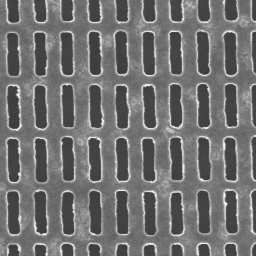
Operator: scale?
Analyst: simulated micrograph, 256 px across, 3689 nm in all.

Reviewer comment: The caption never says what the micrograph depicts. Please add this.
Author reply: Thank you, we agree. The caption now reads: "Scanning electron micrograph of a regular array of holes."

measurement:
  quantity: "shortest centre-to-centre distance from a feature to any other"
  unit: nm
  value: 389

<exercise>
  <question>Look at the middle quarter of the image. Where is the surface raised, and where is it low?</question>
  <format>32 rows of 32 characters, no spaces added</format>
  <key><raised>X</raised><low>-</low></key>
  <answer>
--XXXX---XXXX---XXXX---XXXX---XX
--XXXX---XXXX---XXXX---XXXX---XX
--XXXXX--XXXXXXXXXXXX-XXXXX--XXX
XXXXXXXXXXXXXXXXXXXXXXXXXXXXXXXX
XXXXXXXXXXXXXXXXXXXXXXXXXXXXXXXX
--XXXXX--XXXX--XXXXX--XXXXX--XXX
--XXXX---XXXX---XXXX---XXX---XXX
--XXXX---XXXX---XXXX---XXX---XXX
--XXXX---XXXX---XXXX---XXX---XXX
---XXX---XXXX---XXXX---XXX---XXX
---XXX---XXXX---XXXX---XXX---XXX
---XXXX--XXXX---XXXX---XXX----XX
---XXX----XXX---XXXX---XXXX---XX
---XXX---XXXX---XXXX---XXXX---XX
---XXXX--XXXX---XXXX---XXXX--XXX
--XXXXX--XXXX---XXXXX--XXXX--XXX
XXXXXXXXXXXXXXXXXXXXXXXXXXXXXXXX
XXXXXXXXXXXXXXXXXXXXXXXXXXXXXXXX
--XXXXXXXXXXXX-XXXXXXXXXXXX--XXX
--XXXX---XXXX---XXX---XXXX---XXX
--XXXX---XXXX---XXX----XXX---XXX
--XXXX---XXXX---XXXX---XXX---XXX
--XXXX---XXXX---XXXX---XXX----XX
---XXX---XXXX---XXXX---XXXX---XX
---XXX---XXXX---XXXX---XXXX---XX
---XXXX--XXXX---XXXX---XXXX---XX
---XXXX--XXXX---XXXX---XXXX---XX
---XXX---XXXX---XXXX---XXXX---XX
--XXXX---XXXX---XXXX---XXXX---XX
XXXXXXXXXXXXXXXXXXXXXXXXXXXXXXXX
XXXXXXXXXXXXXXXXXXXXXXXXXXXXXXXX
XXXXXXXXXXXXXXXXXXXXXXXXXXXXXXXX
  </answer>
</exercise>